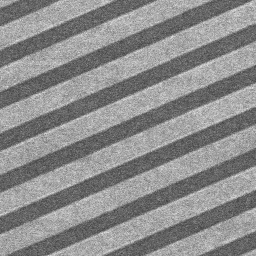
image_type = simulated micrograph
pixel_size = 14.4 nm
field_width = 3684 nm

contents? parallel lines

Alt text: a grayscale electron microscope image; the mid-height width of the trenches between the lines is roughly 258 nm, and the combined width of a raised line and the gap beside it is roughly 0.55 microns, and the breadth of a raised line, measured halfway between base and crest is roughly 286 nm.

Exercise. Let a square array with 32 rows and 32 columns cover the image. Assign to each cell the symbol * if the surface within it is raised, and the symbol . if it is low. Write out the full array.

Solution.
*......******......******......*
....*******.....*******......***
..******......*******.....******
******......******......******..
****.....*******......******....
*......*******.....*******.....*
.....******......******......***
..*******......******......*****
*******.....*******.....*******.
****......******......*******...
**......******......******......
.....*******.....*******......**
...******......*******.....*****
.******......******......******.
*****.....*******......******...
**......*******.....*******.....
......******......******......**
...*******......******......****
.*******.....*******.....*******
*****......******......******...
***......******......******.....
*.....*******.....*******......*
....******......*******.....****
..******......******......******
******.....*******......******..
***......*******.....******.....
*......******......******......*
....*******......******......***
..*******.....*******.....******
******......******......******..
****......******......******....
**.....*******.....*******.....*